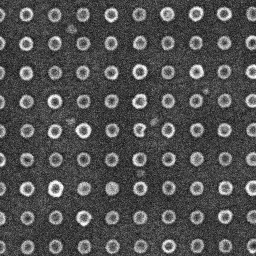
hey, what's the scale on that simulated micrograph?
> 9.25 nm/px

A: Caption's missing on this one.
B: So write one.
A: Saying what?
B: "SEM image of a regular array of raised bodies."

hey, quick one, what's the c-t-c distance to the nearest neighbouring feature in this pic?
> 28.1 px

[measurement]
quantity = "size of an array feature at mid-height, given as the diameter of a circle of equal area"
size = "118 nanometres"